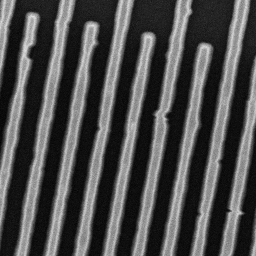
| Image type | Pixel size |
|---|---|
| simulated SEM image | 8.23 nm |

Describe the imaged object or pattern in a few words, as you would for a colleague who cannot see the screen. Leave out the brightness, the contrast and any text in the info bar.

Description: parallel lines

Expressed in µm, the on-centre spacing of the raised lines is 0.238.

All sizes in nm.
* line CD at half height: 95.1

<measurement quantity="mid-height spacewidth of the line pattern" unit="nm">146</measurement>